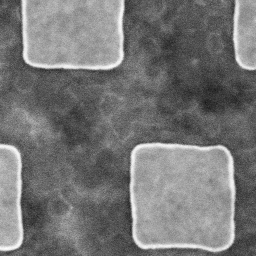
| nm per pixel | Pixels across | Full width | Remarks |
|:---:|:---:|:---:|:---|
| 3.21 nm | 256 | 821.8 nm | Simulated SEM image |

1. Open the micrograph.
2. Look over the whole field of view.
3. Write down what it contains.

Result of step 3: raised bodies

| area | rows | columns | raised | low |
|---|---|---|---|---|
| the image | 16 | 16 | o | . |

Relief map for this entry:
.ooooooo.......o
.ooooooo.......o
..oooooo.......o
..oooooo.......o
................
................
................
................
................
o.......oooooo..
o.......oooooo..
o.......ooooooo.
o.......ooooooo.
o.......ooooooo.
o.......ooooooo.
o............o..